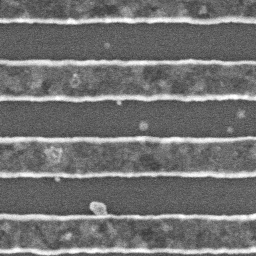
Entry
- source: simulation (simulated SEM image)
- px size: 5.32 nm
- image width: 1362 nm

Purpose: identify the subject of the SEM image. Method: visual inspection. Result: lines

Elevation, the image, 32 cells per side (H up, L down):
HHHHHHHHHHHHHHHHHHHHHHHHHHHHHHHH
HHHHHHHHHHHHHHHHHHHHHHHHHHHHHHHH
HHHHHHHHHHHHHHHHHHHHHHHHHHHHHHHH
LLLLLLLLLLLLLLLLLLLLLLLLLLLLLLLL
LLLLLLLLLLLLLLLLLLLLLLLLLLLLLLLL
LLLLLLLLLLLLLLLLLLLLLLLLLLLLLLLL
LLLLLLLLLLLLLLLLLLLLLLLLLLLLLLLL
LLLLLLLLLLLLLLLLLLLLLLLLLLLLLLLL
HHHHHHHHHHHHHHHHHHHHHHHHHHHHHHHH
HHHHHHHHHHHHHHHHHHHHHHHHHHHHHHHH
HHHHHHHHHHHHHHHHHHHHHHHHHHHHHHHH
HHHHHHHHHHHHHHHHHHHHHHHHHHHHHHHH
LLLLLLLLLHLLLLLLLLLLLLLLLLLLLLLL
LLLLLLLLLLLLLLLLLLLLLLLLLLLLLLLL
LLLLLLLLLLLLLLLLLLLLLLLLLLLLLLLL
LLLLLLLLLLLLLLLLLLLLLLLLLLLLLLLL
LLLLLLLLLLLLLLLLLLLLLLLLLLLLLLLL
HHHHHHHHHHHHHHHHHHHHHHHHHHLHHHHH
HHHHHHHHHHHHHHHHHHHHHHHHHHHHHHHH
HHHHHHHHHHHHHHHHHHHHHHHHHHHHHHHH
HHHHHHHHHHHHHHHHHHHHHHHHHHHHHHHH
HHHHHHHHHHHHHHHHHHHHHHHHHHHHHHHH
LLLLLLLLLLLLLLLLLLLLLLLLLLLLLLLL
LLLLLLLLLLLLLLLLLLLLLLLLLLLLLLLL
LLLLLLLLLLLLLLLLLLLLLLLLLLLLLLLL
LLLLLLLLLLLLLLLLLLLLLLLLLLLLLLLL
LLLLLLLLLLLLLLLLLLLLLLLLLLLLLLLL
HHHHHHHHHHHHHHHHHHHHHHHHHHHHHHHH
HHHHHHHHHHHHHHHHHHHHHHHHHHHHHHHH
HHHHHHHHHHHHHHHHHHHHHHHHHHHHHHHH
HHHHHHHHHHHHHHHHHHHHHHHHHHHHHHHH
LLLLHHHHLLLLLLLLLLLLLLHHHLLLLLLL